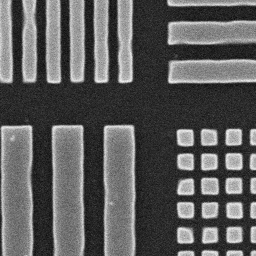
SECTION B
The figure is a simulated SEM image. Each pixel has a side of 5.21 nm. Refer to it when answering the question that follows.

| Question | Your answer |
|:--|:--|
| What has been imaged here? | groups of lines, slits or small figures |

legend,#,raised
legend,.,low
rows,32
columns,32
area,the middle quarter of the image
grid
..###...###...###..........#####
..###...###...###..........#####
..###...###...###..........#####
..###...###...###.........######
..............#............#...#
................................
................................
................................
................................
................................
................................
................................
................................
................................
................................
................................
#####.....#######...............
#####.....#######...........####
#####.....########..........####
#####.....########...........###
#####.....########..............
#####.....########..............
#####.....########..............
#####.....########...........###
#####.....########...........###
####......########...........###
#####.....#######...............
#####.....########..............
#####.....########..............
#####.....########...........###
####......########...........###
####.......#######..........####